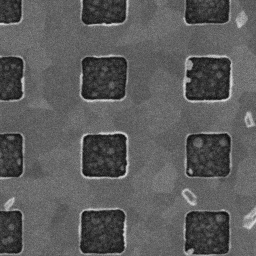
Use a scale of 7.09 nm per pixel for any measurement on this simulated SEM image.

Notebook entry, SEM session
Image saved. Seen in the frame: holes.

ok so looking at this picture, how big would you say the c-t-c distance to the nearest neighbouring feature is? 542 nm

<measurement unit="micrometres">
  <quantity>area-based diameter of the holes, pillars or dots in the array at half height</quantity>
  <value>0.347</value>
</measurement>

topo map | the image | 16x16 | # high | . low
.####...####..##
################
################
################
.####...####..##
.####...####..##
################
################
.#####..####..##
.####...####..##
.####...####..##
################
################
.####...####..##
.####...####..##
.####...####..##